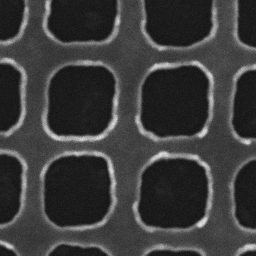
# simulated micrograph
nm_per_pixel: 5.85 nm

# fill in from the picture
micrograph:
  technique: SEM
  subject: holes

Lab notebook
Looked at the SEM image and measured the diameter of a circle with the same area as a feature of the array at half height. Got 435 nanometers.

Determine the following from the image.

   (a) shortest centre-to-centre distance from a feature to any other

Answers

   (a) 533 nanometres